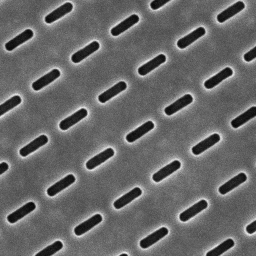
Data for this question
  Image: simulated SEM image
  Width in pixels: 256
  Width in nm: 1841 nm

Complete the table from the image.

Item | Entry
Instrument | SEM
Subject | a regular array of holes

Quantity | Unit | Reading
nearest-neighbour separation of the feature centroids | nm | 342